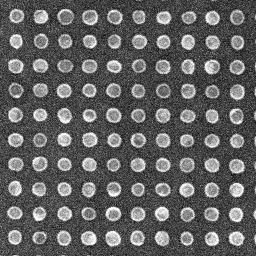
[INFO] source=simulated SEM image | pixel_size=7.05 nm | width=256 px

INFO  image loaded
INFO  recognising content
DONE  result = a regular array of raised bodies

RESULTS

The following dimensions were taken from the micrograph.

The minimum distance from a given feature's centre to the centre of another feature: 0.17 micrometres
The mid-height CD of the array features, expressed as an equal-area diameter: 91.8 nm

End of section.